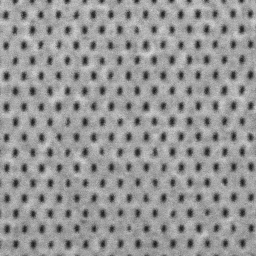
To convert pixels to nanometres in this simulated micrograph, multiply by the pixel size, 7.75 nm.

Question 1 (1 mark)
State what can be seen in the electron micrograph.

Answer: a regular array of holes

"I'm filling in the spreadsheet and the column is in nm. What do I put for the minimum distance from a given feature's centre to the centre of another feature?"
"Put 133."